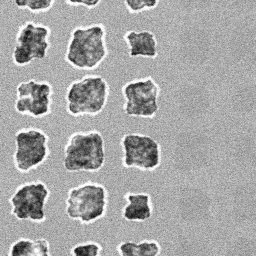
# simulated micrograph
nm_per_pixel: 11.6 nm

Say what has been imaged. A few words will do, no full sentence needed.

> a regular array of holes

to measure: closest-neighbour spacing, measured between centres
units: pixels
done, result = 51.2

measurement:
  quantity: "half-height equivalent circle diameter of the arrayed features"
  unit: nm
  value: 408